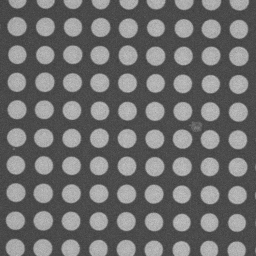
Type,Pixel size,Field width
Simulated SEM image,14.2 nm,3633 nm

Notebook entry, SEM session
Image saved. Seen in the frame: an array of small figures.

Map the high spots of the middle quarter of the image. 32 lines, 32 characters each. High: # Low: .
................................
................................
.##............##...............
####...####...####...####...###.
####...####...####...####...####
####...####...####...####..#####
.##....###....###....###....###.
................................
................................
.##.............................
####...####...####...####...####
####...####...####...####...####
####...####...####...####...####
.##.....##....###....###....###.
................................
................................
.##.....##.....##...............
####...####...####...####...####
####...####...####..#####..#####
####...####...####...####..#####
.##.....##....###....###....###.
................................
................................
.##.....##.....##.....#......#..
####...####...####...####...####
####...####...####..#####..#####
####...####...####..#####..#####
.##.....##.....##....###....###.
................................
................................
.##.....##.....##.....#......#..
####...####...####...####...###.